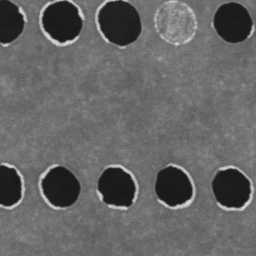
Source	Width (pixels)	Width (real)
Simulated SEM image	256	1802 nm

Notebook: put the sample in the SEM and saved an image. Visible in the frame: holes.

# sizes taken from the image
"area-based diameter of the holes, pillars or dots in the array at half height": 38.8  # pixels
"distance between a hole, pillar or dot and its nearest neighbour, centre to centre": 0.399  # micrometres